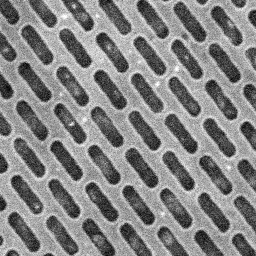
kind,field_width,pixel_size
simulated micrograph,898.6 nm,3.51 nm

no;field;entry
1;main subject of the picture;a regular array of holes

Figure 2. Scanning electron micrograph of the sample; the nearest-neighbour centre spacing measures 0.13 micrometres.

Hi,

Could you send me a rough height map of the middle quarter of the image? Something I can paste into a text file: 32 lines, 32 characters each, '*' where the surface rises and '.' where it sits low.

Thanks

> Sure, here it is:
.***...*****....*****.....****..
..******..***...******....****..
..*****....******..***...******.
...****.....*****...******...***
....****....****.....*****....**
....*****....****.....****....**
.....****.....****....****.....*
*.....****.....***.....****.....
**....*****....****.....****....
***...******....****.....****...
.***..**.***....*****....****...
.******...****.**.****...*****..
..****.....*****...****.**..***.
...****....*****....*****....***
....***.....****.....****.....**
....****.....****.....***.....**
*....****....*****....****.....*
*.....****....****.....****.....
**....****.....****.....****....
***..******....*****....*****...
******...***..*******...*****...
.*****....******...**..***.***..
..****....*****....******...***.
..****.....****.....****.....***
...****.....****.....****....***
....****.....****....****.....**
.....****....****.....****.....*
*....*****....****.....****.....
**...*****....*****.....****....
******..***...******....****....
*****....******..***...******...
.****....******...******...***..